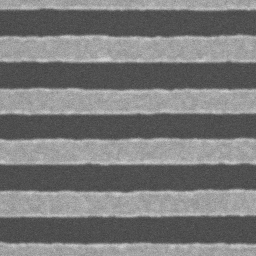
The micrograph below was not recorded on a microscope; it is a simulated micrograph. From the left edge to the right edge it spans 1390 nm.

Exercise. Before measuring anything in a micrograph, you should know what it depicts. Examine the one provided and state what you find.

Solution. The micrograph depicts lines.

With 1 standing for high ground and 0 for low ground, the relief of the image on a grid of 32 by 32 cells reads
11111111111111111111111111111111
00000000000000000000000000000000
00000000000000000000000000000000
00000000000000000000000000000000
00000000000000000000000000000110
11111111111111111111111111111111
11111111111111111111111111111111
11111111111111111111111111111111
00000000000000000000000000000000
00000000000000000000000000000000
00000000000000000000000000000000
11111111111111111111111111111111
11111111111111111111111111111111
11111111111111111111111111111111
00000000000000000000000000000000
00000000000000000000000000000000
00000000000000000000000000000000
00000001000000001101111010000111
11111111111111111111111111111111
11111111111111111111111111111111
00000000000000000000000000000000
00000000000000000000000000000000
00000000000000000000000000000000
00000000000000000000000000000000
11111111111111111111111111111111
11111111111111111111111111111111
11111111111111111111111111111111
00000000000000000000000000000000
00000000000000000000000000000000
00000000000000000000000000000000
10111111000000011110000010010000
11111111111111111111111111111111